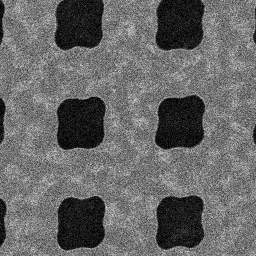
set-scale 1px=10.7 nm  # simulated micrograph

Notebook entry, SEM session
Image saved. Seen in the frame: holes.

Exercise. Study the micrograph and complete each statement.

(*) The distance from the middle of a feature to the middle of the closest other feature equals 1070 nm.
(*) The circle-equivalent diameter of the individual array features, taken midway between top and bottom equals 53.9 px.